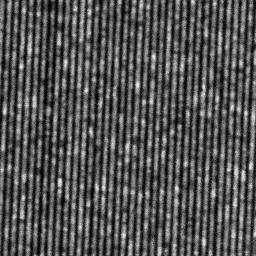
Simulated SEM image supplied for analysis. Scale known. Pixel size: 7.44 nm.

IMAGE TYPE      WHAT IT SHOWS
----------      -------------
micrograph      parallel lines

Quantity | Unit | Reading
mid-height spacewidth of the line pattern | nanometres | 32.5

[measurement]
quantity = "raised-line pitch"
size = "7.31 pixels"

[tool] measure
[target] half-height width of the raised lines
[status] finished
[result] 0.0195 micrometres